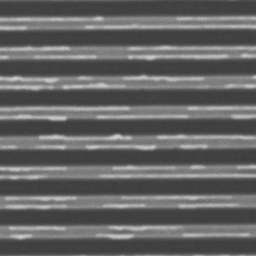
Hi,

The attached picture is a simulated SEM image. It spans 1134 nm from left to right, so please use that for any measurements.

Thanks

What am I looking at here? parallel lines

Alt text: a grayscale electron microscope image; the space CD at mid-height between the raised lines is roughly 16.1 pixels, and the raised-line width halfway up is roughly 63.7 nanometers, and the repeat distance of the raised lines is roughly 0.132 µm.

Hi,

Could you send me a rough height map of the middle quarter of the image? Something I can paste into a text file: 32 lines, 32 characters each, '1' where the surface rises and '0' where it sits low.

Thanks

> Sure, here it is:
00000000000000000000000000000000
00000000000000000000000000000000
00000000000000000000000000000000
11111111111111111111111111111111
11111111111111111111111111111111
11111111111111111111111111111111
00000000000000000000000000000000
00000000000000000000000000000000
00000000000000000000000000000000
00000000000000000000000000000000
00000000000000000000000111111111
11111111111111111111111111111111
11111111111111111111111111111111
11111111111111111111111111111111
00000000000000000000000000000000
00000000000000000000000000000000
00000000000000000000000000000000
00000000000000000000000000000000
11111111111111111111111111111111
11111111111111111111111111111111
11111111111111111111111111111111
00000000000000000000000000000000
00000000000000000000000000000000
00000000000000000000000000000000
00000000000000000000000000000000
11111111111111111111111111111111
11111111111111111111111111111111
11111111111111111111111111111111
11111111111111110111111111111111
00000000000000000000000000000000
00000000000000000000000000000000
00000000000000000000000000000000